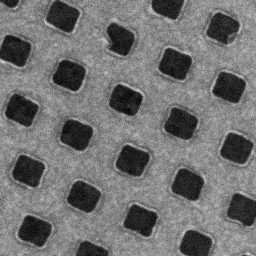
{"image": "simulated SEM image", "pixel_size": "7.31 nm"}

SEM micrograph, a regular array of raised bodies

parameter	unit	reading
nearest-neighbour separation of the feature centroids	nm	436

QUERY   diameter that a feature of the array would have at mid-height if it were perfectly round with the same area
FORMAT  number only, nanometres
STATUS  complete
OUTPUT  244